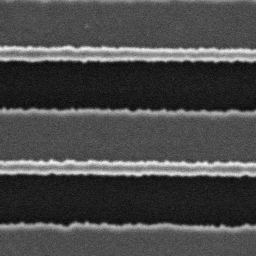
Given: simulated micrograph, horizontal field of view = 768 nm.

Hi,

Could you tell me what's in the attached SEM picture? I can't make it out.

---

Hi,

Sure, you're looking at lines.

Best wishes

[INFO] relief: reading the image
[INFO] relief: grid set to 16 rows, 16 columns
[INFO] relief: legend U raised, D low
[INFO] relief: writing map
UUUUUUUUUUUUUUUU
UUUUUUUUUUUUUUUU
UUUUUUUUUUUUUUUU
UUUUUUUUUUUUUUUU
DDDDDDDDDDDDDDDD
DDDDDDDDDDDDDDDD
DDDDDDDDDDDDDDDD
UUUUUUUUUUUUUUUU
UUUUUUUUUUUUUUUU
UUUUUUUUUUUUUUUU
UUUUUUUUUUUUUUUU
DDDDDDDDDDDDDDDD
DDDDDDDDDDDDDDDD
DDDDDDDDDDDDDDDD
UUUUUUUUUUUUUUUU
UUUUUUUUUUUUUUUU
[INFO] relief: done